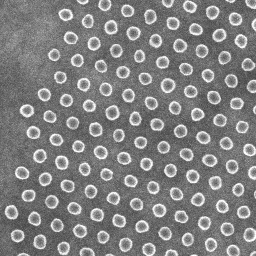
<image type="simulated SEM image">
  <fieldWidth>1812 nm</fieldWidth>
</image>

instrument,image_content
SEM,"a regular array of raised bodies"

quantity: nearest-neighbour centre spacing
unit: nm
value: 162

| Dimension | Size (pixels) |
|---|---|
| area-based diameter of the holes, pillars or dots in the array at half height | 11.9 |